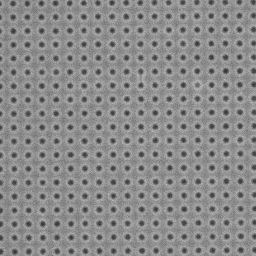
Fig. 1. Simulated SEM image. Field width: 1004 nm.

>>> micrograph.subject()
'a regular array of holes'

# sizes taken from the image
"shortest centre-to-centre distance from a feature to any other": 52.9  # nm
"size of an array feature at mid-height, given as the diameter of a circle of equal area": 24.6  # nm